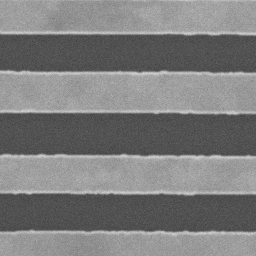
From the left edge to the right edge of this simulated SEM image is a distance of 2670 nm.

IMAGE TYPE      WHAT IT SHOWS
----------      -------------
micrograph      lines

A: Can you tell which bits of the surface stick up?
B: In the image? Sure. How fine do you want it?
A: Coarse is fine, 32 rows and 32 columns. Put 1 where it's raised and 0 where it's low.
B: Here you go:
11111111111111111111111111111111
11111111111111111111111111111111
11111111111111111111111111111111
11111111111111111111111111111111
00000000000000000000000000000000
00000000000000000000000000000000
00000000000000000000000000000000
00000000000000000000000000000000
00000000000000000000000000000000
11111111111111111111111111111111
11111111111111111111111111111111
11111111111111111111111111111111
11111111111111111111111111111111
11111111111111111111111111111111
00000000000000000000000000000000
00000000000000000000000000000000
00000000000000000000000000000000
00000000000000000000000000000000
00000000000000000000000000000000
11111111111010111000000000000000
11111111111111111111111111111111
11111111111111111111111111111111
11111111111111111111111111111111
11111111111111111111111111111111
00000000000000000000000000000000
00000000000000000000000000000000
00000000000000000000000000000000
00000000000000000000000000000000
00000000000000000000000000000000
11111111111111111111111111111111
11111111111111111111111111111111
11111111111111111111111111111111